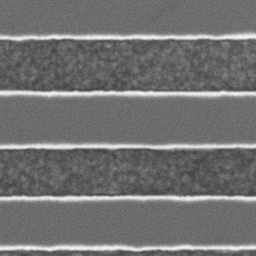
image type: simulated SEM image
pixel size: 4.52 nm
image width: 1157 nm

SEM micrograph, lines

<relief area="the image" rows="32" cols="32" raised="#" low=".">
################################
################################
################################
################################
################################
................................
................................
................................
................................
................................
................................
####.......####.##.........#....
################################
################################
################################
################################
################################
################################
####.####..........###..........
................................
................................
................................
................................
................................
................................
################################
################################
################################
################################
################################
################################
................................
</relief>